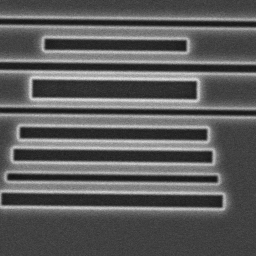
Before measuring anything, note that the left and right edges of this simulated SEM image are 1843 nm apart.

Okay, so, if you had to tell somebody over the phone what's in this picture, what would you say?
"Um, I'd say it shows groups of lines, slits or small figures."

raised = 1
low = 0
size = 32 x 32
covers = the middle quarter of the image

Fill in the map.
00000000000000000000000000000000
00000000000000000000000000000000
11111111111111111111111111111111
11111111111111111111111111111111
00000000000000000000000000000000
00000000000000000000000000000000
00000000000000000000000000000000
00000000000000000000000000000000
00000000000000000000000000000000
11111111111111111111111111111111
11111111111111111111111111111111
00000000000000000000000000000000
00000000000000000000000000000000
11111111111111111111111111111111
11111111111111111111111111111111
01111111111111111111111111111111
00000000000000000000000000000000
00000000000000000000000000000000
00000000000000000000000000000000
11111111111111111111111111111111
11111111111111111111111111111111
00000000000000000000000000000000
00000000000000000000000000000000
00000000000000000000000000000000
00000000000000000000000000000000
11111111111111111111111111111111
11111111111111111111111111111111
00000000000000000011111111111111
00000000000000000000000000000000
00000000000000000000000000000000
11111111111111111111111111111111
11111111111111111111111111111111